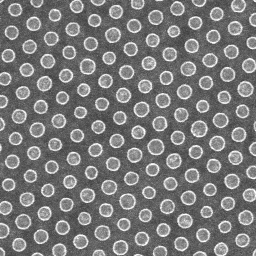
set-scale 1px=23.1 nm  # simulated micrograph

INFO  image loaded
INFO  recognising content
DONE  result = a regular array of raised bodies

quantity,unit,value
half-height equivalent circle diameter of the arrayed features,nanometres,292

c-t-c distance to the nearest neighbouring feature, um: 0.525